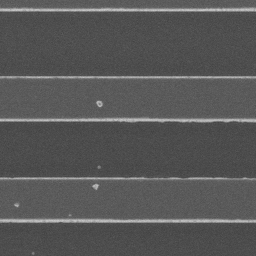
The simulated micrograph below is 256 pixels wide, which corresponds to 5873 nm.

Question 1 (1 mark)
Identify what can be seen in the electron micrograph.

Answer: lines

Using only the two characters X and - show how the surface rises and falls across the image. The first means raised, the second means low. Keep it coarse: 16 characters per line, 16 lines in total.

XXXXXXXXXXXXXXXX
----------------
----------------
----------------
----------------
XXXXXXXXXXXXXXXX
XXXXXXXXXXXXXXXX
XXXXXXXXXXXXXXXX
----------------
----------------
----------------
XXXXXXXXXXXXXXXX
XXXXXXXXXXXXXXXX
XXXXXXXXXXXXXXXX
----------------
----------------